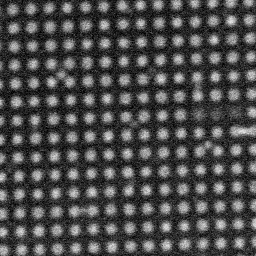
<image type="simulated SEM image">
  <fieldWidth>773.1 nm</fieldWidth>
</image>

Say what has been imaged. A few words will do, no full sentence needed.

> a regular array of raised bodies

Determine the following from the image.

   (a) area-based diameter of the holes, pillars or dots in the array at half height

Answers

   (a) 26.8 nm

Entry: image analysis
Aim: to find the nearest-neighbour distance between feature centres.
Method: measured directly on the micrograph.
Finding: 0.0544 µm